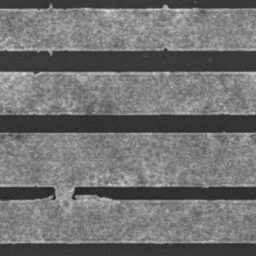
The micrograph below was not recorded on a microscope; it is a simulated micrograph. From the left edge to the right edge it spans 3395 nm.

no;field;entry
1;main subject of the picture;one or a few lines or trenches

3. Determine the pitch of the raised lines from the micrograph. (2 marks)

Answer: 848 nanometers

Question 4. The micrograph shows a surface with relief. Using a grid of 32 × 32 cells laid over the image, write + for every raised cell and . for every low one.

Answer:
................................
++++++++++++++++++++++++++++++++
++++++++++++++++++++++++++++++++
++++++++++++++++++++++++++++++++
++++++++++++++++++++++++++++++++
++++++++++++++++++++++++++++++++
................................
................................
................................
++++++++++++++++++++++++++++++++
++++++++++++++++++++++++++++++++
++++++++++++++++++++++++++++++++
++++++++++++++++++++++++++++++++
++++++++++++++++++++++++++++++++
................................
................................
................................
++++++++++++++++++++++++++++++++
++++++++++++++++++++++++++++++++
++++++++++++++++++++++++++++++++
++++++++++++++++++++++++++++++++
++++++++++++++++++++++++++++++++
++++++++++++++++++++++++++++++++
.......++.......................
.......++.......................
++++++++++++++++++++++++++++++++
++++++++++++++++++++++++++++++++
++++++++++++++++++++++++++++++++
++++++++++++++++++++++++++++++++
++++++++++++++++++++++++++++++++
................................
................................